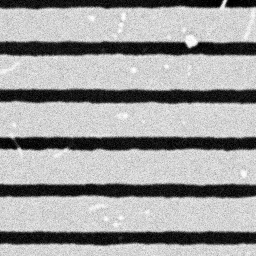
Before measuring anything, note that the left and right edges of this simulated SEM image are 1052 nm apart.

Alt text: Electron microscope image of lines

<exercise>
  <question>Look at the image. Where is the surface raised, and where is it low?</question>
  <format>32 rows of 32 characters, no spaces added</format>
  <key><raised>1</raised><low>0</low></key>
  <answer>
00000000000000000000000000000000
11111111111111111111111111111111
11111111111111111111111111111111
11111111111111111111111111111111
11111111111111111111111111111111
00000000000000000000000110000000
00000000000000000000000000000000
11111111111111111111111111111111
11111111111111111111111111111111
11111111111111111111111111111111
11111111111111111111111111111111
00000000000000000000000000000000
00000000000000000000000000000000
11111111111111111111111111111111
11111111111111111111111111111111
11111111111111111111111111111111
11111111111111111111111111111111
00000000000000000000000000000000
00000000000000000000000000000000
11111111111111111111111111111111
11111111111111111111111111111111
11111111111111111111111111111111
11111111111111111111111111111111
00000000000000000000000000000000
00000000000000000000000000000000
11111111111111111111111111111111
11111111111111111111111111111111
11111111111111111111111111111111
11111111111111111111111111111111
00000000000000000000000000000000
00000000000000001100000000000000
11111111111111111111111111111111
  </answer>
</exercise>